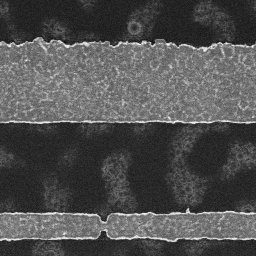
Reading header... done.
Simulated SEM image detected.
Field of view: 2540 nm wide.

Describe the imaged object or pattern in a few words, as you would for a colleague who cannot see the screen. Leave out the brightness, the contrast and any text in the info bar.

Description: one or a few lines or trenches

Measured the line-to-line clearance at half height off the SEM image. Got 91.1 pixels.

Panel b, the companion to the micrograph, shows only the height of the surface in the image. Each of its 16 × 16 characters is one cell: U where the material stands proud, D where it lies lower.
DDDDDDDDDDDDDDDD
DDDDDDDDDDDDDDDD
DDUDDDDDDDDDDDDD
UUUUUUUUUUUUUUUU
UUUUUUUUUUUUUUUU
UUUUUUUUUUUUUUUU
UUUUUUUUUUUUUUUU
UUUUUUUUUUUUUUUU
DDDDDDDDDDDDDDDD
DDDDDDDDDDDDDDDD
DDDDDDDDDDDDDDDD
DDDDDDDDDDDDDDDD
DDDDDDDDDDDDDDDD
UUUUUUDUUUUUUUUU
UUUUUUUUUUUUUUUU
DDDDDDDDDDDDDDDD